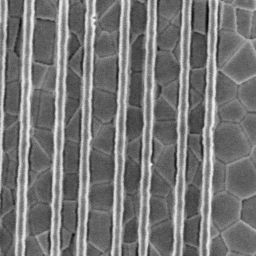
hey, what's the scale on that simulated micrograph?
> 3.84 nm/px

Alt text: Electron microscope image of parallel lines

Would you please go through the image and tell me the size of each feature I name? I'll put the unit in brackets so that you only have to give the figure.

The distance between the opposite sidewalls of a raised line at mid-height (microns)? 0.0297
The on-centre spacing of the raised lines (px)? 30.7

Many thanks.